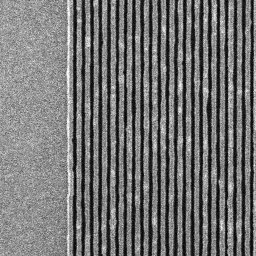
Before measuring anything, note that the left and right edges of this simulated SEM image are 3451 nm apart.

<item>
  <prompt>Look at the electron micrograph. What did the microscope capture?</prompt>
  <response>parallel lines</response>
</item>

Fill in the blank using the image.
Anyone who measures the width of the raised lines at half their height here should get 65.7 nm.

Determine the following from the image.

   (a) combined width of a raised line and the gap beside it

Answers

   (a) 0.114 µm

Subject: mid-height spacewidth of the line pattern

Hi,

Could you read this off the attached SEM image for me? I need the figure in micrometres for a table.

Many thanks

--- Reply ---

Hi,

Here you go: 0.0522